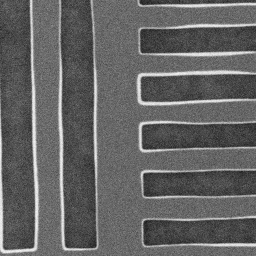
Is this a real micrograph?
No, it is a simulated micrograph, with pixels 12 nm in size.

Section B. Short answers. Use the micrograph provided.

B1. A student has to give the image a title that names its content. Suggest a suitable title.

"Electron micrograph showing groups of lines, slits or small figures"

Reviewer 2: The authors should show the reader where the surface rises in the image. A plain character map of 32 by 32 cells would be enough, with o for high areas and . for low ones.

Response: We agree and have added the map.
....oooo...ooooooo..............
....oooo....oooooooooooooooooooo
....oooo....oooooooooooooooooooo
....ooo.....oooooo..............
....ooo.....ooooo...............
....ooo.....ooooo...............
....oooo....oooooo..............
....oooo....oooooooooooooooooooo
....oooo....oooooooooooooooooooo
....oooo....oooooo..............
....oooo....ooooo...............
....oooo....ooooo...............
....oooo....oooooo...........ooo
....ooo.....oooooooooooooooooooo
....oooo....oooooooooooooooooooo
....oooo....oooooo..............
....oooo....oooooo..............
....oooo....oooooo..............
....oooo....oooooo..........oooo
....oooo....oooooooooooooooooooo
....oooo....oooooooooooooooooooo
....oooo....oooooo..............
....oooo....oooooo..............
.....ooo....oooooo..............
.....ooo....oooooo............oo
.....ooo....oooooooooooooooooooo
.....ooo....oooooooooooooooooooo
.....ooo....oooooo..............
.....ooo....oooooo..............
.....ooo....oooooo..............
....oooo....oooooo..............
oooooooooooooooooooooooooooooooo